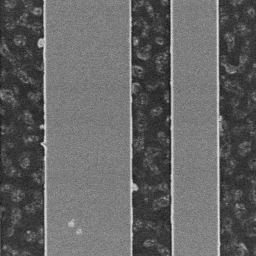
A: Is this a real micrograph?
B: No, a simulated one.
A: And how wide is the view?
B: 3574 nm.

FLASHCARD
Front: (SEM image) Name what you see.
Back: one or a few lines or trenches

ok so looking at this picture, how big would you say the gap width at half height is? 0.567 µm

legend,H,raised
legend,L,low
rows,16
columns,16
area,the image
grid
LLLHHHHHLLLHHHLL
LLLHHHHHLLLHHHLL
LLLHHHHHLLLHHHLL
LLLHHHHHLLLHHHLL
LLLHHHHHLLLHHHLL
LLLHHHHHLLLHHHLL
LLLHHHHHLLLHHHLL
LLLHHHHHLLLHHHLL
LLLHHHHHLLLHHHLL
LLLHHHHHLLLHHHLL
LLLHHHHHLLLHHHLL
LLLHHHHHLLLHHHLL
LLLHHHHHLLLHHHLL
LLLHHHHHLLLHHHLL
LLLHHHHHLLLHHHLL
LLLHHHHHLLLHHHLL